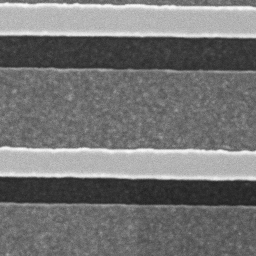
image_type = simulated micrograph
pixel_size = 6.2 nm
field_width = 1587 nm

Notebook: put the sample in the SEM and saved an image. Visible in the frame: lines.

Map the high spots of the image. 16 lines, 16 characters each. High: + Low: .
++++++++++++++++
++++++++++++++++
................
................
++++++++++++++++
++++++++++++++++
++++++++++++++++
++++++++++++++++
++++++++++++++++
++++++++++++++++
++++++++++++++++
................
................
++++++++++++++++
++++++++++++++++
++++++++++++++++